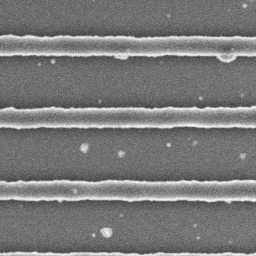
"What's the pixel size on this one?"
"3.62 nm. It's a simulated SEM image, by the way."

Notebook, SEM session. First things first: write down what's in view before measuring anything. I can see lines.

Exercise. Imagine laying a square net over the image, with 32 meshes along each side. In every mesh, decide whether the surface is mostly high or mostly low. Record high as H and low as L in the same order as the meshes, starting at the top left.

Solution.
LLLLLLLLLLLLLLLLLLLLLLLLLLLLLLLL
LLLLLLLLLLLLLLLLLLLLLLLLLLLLLLLL
LLLLLLLLLLLLLLLLLLLLLLLLLLLLLLLL
LLLLLLLLLLLLLLLLLLLLLLLLLLLLLLLL
LHLLLLLLLLLLLLLLLLLLLLLLLLLLLLLL
HHHHHHHHHHHHHHHHHHHHHHHHHHHHHHHH
HHHHHHHHHHHHHHHHHHHHHHHHHHHHHHHH
LLLLLLLLLLLLLLLLLLLLLLLLLLLLLLLL
LLLLLLLLLLLLLLLLLLLLLLLLLLLLLLLL
LLLLLLLLLLLLLLLLLLLLLLLLLLLLLLLL
LLLLLLLLLLLLLLLLLLLLLLLLLLLLLLLL
LLLLLLLLLLLLLLLLLLLLLLLLLLLLLLLL
LLLLLLLLLLLLLLLLLLLLLLLLLLLLLLLL
LLLLLLHLLLLLLLLLLLLLLHLLLLLHLHHH
HHHHHHHHHHHHHHHHHHHHHHHHHHHHHHHH
HHHHHHHHHHHHHHHHHHHHHHHHHHHHHHHH
LLLLLLLLLLLLLLLLLLLLLLLLLLLLLLLL
LLLLLLLLLLLLLLLLLLLLLLLLLLLLLLLL
LLLLLLLLLLLLLLLLLLLLLLLLLLLLLLLL
LLLLLLLLLLLLLLLLLLLLLLLLLLLLLLLL
LLLLLLLLLLLLLLLLLLLLLLLLLLLLLLLL
LLLLLLLLLLLLLLLLLLLLLLLLLLLLLLLL
LLLLLLLLLLLLLLLLLLLLLLLLLLLLLLLL
HHHHHHHHHHHHHHHHHHHHHHHHHHHHHHHH
HHHHHHHHHHHHHHHHHHHHHHHHHHHHHHHH
LLLLLLLLLLLLLLLLLLLLLLLLLLLLLLLL
LLLLLLLLLLLLLLLLLLLLLLLLLLLLLLLL
LLLLLLLLLLLLLLLLLLLLLLLLLLLLLLLL
LLLLLLLLLLLLLLLLLLLLLLLLLLLLLLLL
LLLLLLLLLLLLLLLLLLLLLLLLLLLLLLLL
LLLLLLLLLLLLLLLLLLLLLLLLLLLLLLLL
LLLLLLLLLLLLLLLLLLLLLLLLLLLLLLLL